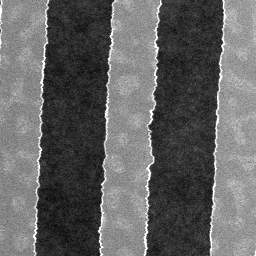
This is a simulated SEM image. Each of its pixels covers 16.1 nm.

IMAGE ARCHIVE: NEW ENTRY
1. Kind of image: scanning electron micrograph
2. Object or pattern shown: one or a few lines or trenches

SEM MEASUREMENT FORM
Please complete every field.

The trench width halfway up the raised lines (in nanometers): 716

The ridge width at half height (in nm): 1060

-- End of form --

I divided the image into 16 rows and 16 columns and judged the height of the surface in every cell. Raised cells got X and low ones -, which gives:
---XXXX---XXXX--
---XXXX---XXXX--
---XXXX---XXXX--
---XXXX---XXXX--
---XXXX---XXXX--
---XXXX---XXXX--
---XXXX---XXXX--
---XXXX--XXXXX--
---XXXX--XXXXX--
--XXXXX--XXXX---
--XXXXX--XXXX---
--XXXX---XXXX---
--XXXX---XXXX---
--XXXX---XXXX---
--XXXX---XXXX---
--XXXX---XXXX---